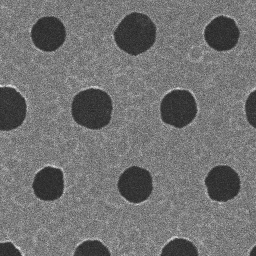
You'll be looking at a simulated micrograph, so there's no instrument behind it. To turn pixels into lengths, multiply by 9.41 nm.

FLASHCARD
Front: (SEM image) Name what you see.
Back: a regular array of holes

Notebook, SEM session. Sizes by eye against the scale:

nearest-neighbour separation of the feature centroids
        0.813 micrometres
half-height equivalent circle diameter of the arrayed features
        344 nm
